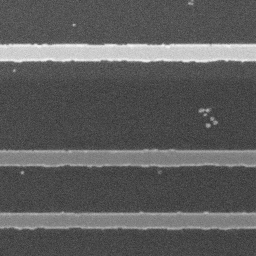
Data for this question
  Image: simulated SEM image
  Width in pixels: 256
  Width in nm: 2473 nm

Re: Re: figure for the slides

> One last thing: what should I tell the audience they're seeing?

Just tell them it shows lines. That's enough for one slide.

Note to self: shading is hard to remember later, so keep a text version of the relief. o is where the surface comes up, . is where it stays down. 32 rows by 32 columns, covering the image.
................................
................................
................................
................................
................................
................................
oooooooooooooooooooooooooooooooo
ooooooooooooooo.oooooooooooooooo
................................
................................
................................
................................
................................
................................
................................
................................
................................
................................
................................
oooooooooooooooooooooooooooooooo
oooooooooooooooooooooooooooooooo
................................
................................
................................
................................
................................
................................
oooooooooooooooooooooooooooooooo
ooooooooo.oooooooooooooooooooooo
................................
................................
................................